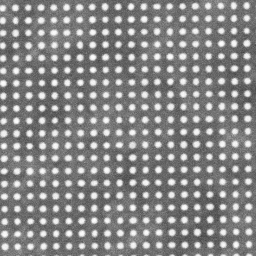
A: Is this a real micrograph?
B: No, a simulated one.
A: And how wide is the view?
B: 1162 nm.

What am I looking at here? a regular array of raised bodies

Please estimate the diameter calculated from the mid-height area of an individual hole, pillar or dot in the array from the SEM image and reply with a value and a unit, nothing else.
26.9 nm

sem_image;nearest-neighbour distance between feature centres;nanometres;56.4